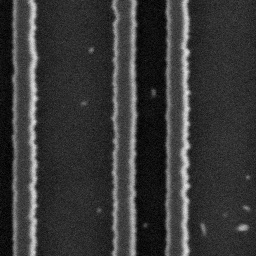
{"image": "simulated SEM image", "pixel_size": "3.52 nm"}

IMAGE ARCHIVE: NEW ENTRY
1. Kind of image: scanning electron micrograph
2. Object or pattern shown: lines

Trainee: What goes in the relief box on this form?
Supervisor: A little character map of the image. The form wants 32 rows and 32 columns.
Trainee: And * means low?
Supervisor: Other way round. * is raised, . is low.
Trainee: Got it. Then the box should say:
..**..........***....**.........
..**..........***....**.........
..**..........***....***........
..**..........***....***........
..**..........***....**.........
..**..........***....**.........
..**..........***....***........
..***.........***....**.........
..**..........***....**.........
..**..........***....**.........
..**..........***....**.........
..**..........***....***........
..**..........***....**.........
..**..........***....***........
..**..........***....**.........
..**..........***....**.........
..**..........***....**.........
..**..........***....**.........
..**..........***....**.........
..**..........***....**.........
..***.........***....***........
..**..........***....**.........
..**..........***....**.........
..**..........***....**.........
..**..........***....**.........
..**..........***....**.........
..**..........***....**.........
..**..........***....**.........
..**..........***....**.........
..**..........***....**.........
..**..........***....**.........
..**..........***....**.........